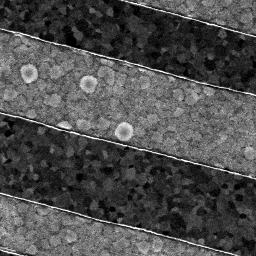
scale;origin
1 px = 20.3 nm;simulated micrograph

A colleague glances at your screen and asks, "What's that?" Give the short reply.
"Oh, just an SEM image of one or a few lines or trenches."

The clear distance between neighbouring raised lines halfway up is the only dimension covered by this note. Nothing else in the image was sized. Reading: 79.4 pixels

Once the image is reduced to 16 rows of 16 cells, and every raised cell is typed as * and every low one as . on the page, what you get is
*********.......
*************...
...*************
......**********
.*........******
.....*.......***
................
**..............
******.*........
**********......
*************...
****************
.***************
.....***********
.........*******
.............***